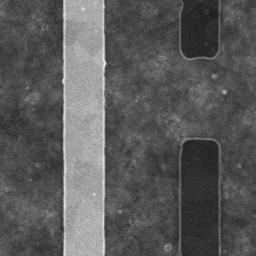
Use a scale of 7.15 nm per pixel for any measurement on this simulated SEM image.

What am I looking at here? one or a few lines or trenches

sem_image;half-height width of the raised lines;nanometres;282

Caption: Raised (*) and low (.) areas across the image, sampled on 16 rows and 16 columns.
....**.....***..
....**.....***..
....**.....***..
....***.....*...
....***.........
....**..........
....**..........
....**..........
....**..........
....**.....***..
....**.....***..
....**.....***..
....**.....***..
....**.....***..
....**.....***..
....**.....***..